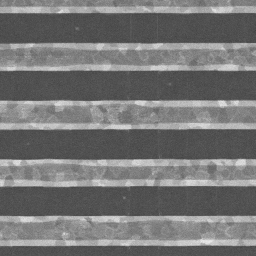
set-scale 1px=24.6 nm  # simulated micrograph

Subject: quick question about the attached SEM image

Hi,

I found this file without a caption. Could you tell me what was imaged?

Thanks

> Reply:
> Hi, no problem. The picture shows wiring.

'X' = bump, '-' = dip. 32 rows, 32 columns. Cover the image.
XXXXXXXXXXXXXXXXXXXXXXXXXXXXXXXX
--------------------------------
--------------------------------
--------------------------------
--------------------------------
--------------------------------
XXXXXXXXXXXXXXXXXXXXXXXXXXXXXXXX
XXXXXXXXXXXXXXXXXXXXXXXXXXXXXXXX
--------------------------------
--------------------------------
--------------------------------
--------------------------------
--------------------------------
XXXXXXXXXXXXXXXXXXXXXXXXXXXXXXXX
XXXXXXXXXXXXXXXXXXXXXXXXXXXXXXXX
XXXXXXXXXXXXXXXXXXXXXXXXXXXXXXXX
--------------------------------
--------------------------------
--------------------------------
--------------------------------
XXXXXXXXXXXXXXXXXXXXXXXXXXXXXXXX
XXXXXXXXXXXXXXXXXXXXXXXXXXXXXXXX
XXXXXXXXXXXXXXXXXXXXXXXXXXXXXXXX
--------------------------------
--------------------------------
--------------------------------
--------------------------------
XXXXXXXXXXXXXXXXXXXXXXXXXXXXXXXX
XXXXXXXXXXXXXXXXXXXXXXXXXXXXXXXX
XXXXXXXXXXXXXXXXXXXXXXXXXXXXXXXX
--------------------------------
--------------------------------